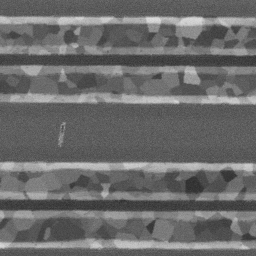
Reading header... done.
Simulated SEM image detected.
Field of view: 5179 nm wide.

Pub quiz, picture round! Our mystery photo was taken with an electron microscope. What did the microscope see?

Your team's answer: lines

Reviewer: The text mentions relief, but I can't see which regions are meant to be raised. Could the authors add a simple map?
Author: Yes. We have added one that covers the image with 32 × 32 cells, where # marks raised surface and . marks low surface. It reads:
................................
................................
................................
################################
################################
################################
............................####
................................
................................
################################
################################
################################
................................
................................
................................
................................
................................
................................
................................
................................
................................
################################
################################
################################
.#########..####################
................................
................................
################################
################################
################################
#########......#################
................................